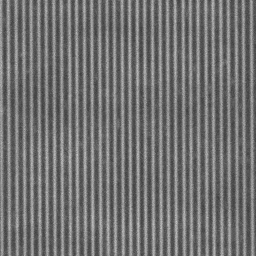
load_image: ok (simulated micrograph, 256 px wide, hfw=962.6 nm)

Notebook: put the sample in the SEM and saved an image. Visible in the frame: parallel lines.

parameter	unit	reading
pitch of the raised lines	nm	28.6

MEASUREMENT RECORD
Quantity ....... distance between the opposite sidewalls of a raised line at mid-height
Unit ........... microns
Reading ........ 0.0085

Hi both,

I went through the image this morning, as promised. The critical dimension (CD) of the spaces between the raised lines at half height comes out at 20.2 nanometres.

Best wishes